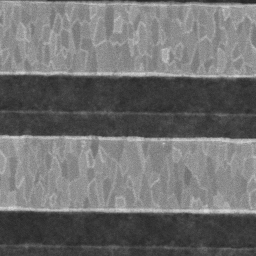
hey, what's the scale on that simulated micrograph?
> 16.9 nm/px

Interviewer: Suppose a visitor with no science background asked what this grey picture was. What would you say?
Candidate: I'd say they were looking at lines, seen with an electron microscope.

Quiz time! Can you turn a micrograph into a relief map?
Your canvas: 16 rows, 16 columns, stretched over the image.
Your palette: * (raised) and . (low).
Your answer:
****************
****************
****************
****************
****************
................
................
................
................
****************
****************
****************
****************
................
................
................